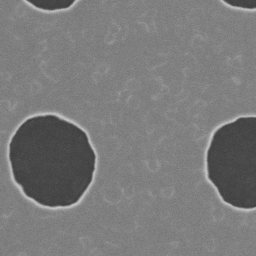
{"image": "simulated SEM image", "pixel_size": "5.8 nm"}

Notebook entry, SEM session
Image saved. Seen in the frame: holes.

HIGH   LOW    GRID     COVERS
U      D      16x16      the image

UUDDUUUUUUUUUUUD
UUUUUUUUUUUUUUUU
UUUUUUUUUUUUUUUU
UUUUUUUUUUUUUUUU
UUUUUUUUUUUUUUUU
UUUUUUUUUUUUUUUU
UUUUUUUUUUUUUUUU
UUDDUUUUUUUUUUUD
UDDDDUUUUUUUUDDD
UDDDDDUUUUUUUDDD
UDDDDDUUUUUUUDDD
UDDDDDUUUUUUUDDD
UUDDDUUUUUUUUUDD
UUUUUUUUUUUUUUUU
UUUUUUUUUUUUUUUU
UUUUUUUUUUUUUUUU